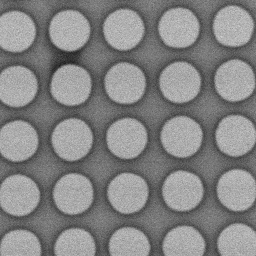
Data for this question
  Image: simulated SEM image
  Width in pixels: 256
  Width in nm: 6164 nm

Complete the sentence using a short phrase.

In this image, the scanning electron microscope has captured an array of small figures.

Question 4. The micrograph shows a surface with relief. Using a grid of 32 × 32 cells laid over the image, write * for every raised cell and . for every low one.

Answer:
................................
.**.....**....***....***...****.
****...****..*****..*****..*****
****..*****..*****..*****..*****
****..*****..*****..*****..****.
****...****...***....***....***.
................................
................................
.**....***....***....***...****.
****...****..*****..*****..*****
*****.*****..*****..*****..*****
*****.*****..*****..*****..****.
****...****...***....***....**..
................................
.............................*..
.***...****...****...****..*****
****...****..*****..*****..*****
*****..*****.*****..*****..*****
*****..****...****...****..****.
****...***.....**.....**........
................................
......................**....***.
.***...****...****...****..*****
*****..*****..****..*****..*****
*****..*****.*****..*****..*****
*****..****...****...****...****
.***....**.....**...............
................................
...............*......**....***.
.***...****...****...****..*****
*****..*****..*****.******.*****
*****..*****..*****.*****..*****